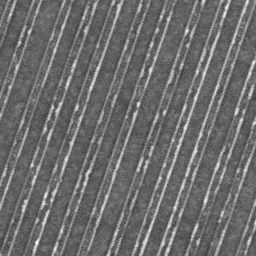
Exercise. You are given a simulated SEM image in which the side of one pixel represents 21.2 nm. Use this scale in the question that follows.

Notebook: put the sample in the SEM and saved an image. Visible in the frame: parallel lines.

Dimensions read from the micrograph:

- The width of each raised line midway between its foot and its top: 172 nm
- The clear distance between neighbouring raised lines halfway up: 345 nanometers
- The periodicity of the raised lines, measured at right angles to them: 528 nm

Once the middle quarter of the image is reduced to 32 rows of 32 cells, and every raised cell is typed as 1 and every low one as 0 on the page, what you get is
11100011100000110000110000011100
11000011000001100001110000011000
11000011000001100001100000011000
11000011000001100001100000111000
10000110000011000011100000110000
10000110000011000011000000110000
10001110000011000011000001100000
00001100000110000111000001100001
00001100000110000110000001100001
00001100001110000110000011000001
00011000001100001110000011000011
00011000001100001100000011000011
00111000011100001100000110000111
00110000011000011100000110000110
00110000011000011000000100000110
01110000110000011000001100001110
01100000110000111000001100001100
01100000110000110000001000001100
11100001100000110000011000011100
11000001100001110000011000011000
11000001100001100000111000011000
10000011000011100000110000110000
10000011000011000000110000110000
10000011000011000001100000110000
00000110000111000001100001100000
00000110000110000001100001100001
00000110000110000011000001100001
00001100001110000011000011000001
00001100001100000011000011000011
00011100001100000110000011000011
00011000001100000110000110000011
00011000011000000110000110000110